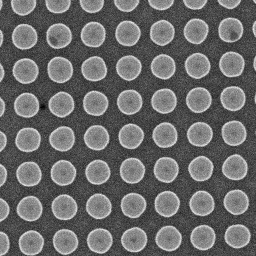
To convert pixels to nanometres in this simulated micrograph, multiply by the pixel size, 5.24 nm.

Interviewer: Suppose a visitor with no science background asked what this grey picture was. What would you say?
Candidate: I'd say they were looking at an array of small figures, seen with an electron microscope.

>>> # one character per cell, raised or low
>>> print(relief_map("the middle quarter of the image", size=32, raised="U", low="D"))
UUDDDUUUUUDDDUUUUUUDDDUUUUUUDDUU
UUDDUUUUUUUDDUUUUUUDDDUUUUUUDDDU
UUDDDUUUUUUDDDUUUUUDDDUUUUUDDDDU
UDDDDUUUUUDDDDDUUUDDDDDDUUDDDDDD
DDDDDDDDDDDDDDDDDDDDDDDDDDDDDDDD
DDDDDDDDDDDDDDDDDDDDDDDDDDDDDDDD
DDDDDDDDDDDDDDDDDDDDDDDDUUUDDDDD
UDDDDDUUUUDDDDUUUUUDDDDUUUUDDDDU
UUDDDUUUUUUDDDUUUUUDDDUUUUUUDDDU
UUDDDUUUUUUDDUUUUUUDDDUUUUUUDDDU
UUDDDUUUUUUDDDUUUUUDDDUUUUUUDDDU
UUDDDUUUUUDDDDUUUUUDDDDUUUUDDDDD
UDDDDDUUUUDDDDDDUDDDDDDDDDDDDDDD
DDDDDDDDDDDDDDDDDDDDDDDDDDDDDDDD
DDDDDDDDDDDDDDDDDDDDDDDDDDDDDDDD
DDDDDDDDUDDDDDDUUUDDDDDUUUUDDDDD
UUDDDDUUUUDDDDUUUUUDDDDUUUUUDDDU
UUDDDUUUUUUDDDUUUUUUDDUUUUUUDDDU
UUDDDUUUUUUDDDUUUUUUDDUUUUUUDDDU
UUDDDUUUUUUDDDUUUUUDDDDUUUUUDDDU
UUDDDDUUUUDDDDDUUUUDDDDDUUUDDDDD
UDDDDDDDDDDDDDDDDDDDDDDDDDDDDDDD
DDDDDDDDDDDDDDDDDDDDDDDDDDDDDDDD
DDDDDDDDDDDDDDDDDDDDDDDDUUDDDDDD
UDDDDDDUUUDDDDDUUUUDDDDUUUUUDDDD
UUDDDDUUUUUDDDUUUUUUDDDUUUUUDDDU
UUUDDDUUUUUDDDUUUUUUDDDUUUUUUDDU
UUUDDDUUUUUDDDUUUUUUDDDUUUUUDDDD
UUUDDDUUUUUDDDDUUUUUDDDUUUUUDDDD
UUDDDDDUUUDDDDDDUUDDDDDDDUUDDDDD
DDDDDDDDDDDDDDDDDDDDDDDDDDDDDDDD
DDDDDDDDDDDDDDDDDDDDDDDDDDDDDDDD